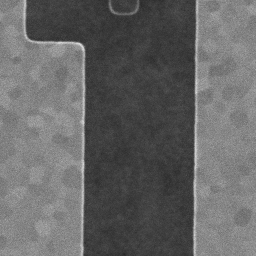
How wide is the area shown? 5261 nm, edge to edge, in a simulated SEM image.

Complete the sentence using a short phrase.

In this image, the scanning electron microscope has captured wiring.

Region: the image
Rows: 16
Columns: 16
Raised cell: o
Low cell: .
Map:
oo.....oo...oooo
oo..........oooo
oo..........oooo
ooooo.......oooo
ooooo.......oooo
ooooo.......oooo
ooooo.......oooo
ooooo.......oooo
ooooo.......oooo
ooooo.......oooo
ooooo.......oooo
ooooo.......oooo
ooooo.......oooo
ooooo.......oooo
ooooo.......oooo
ooooo.......oooo